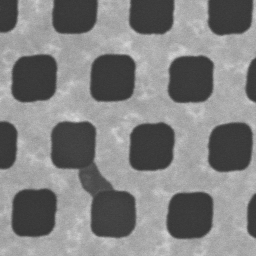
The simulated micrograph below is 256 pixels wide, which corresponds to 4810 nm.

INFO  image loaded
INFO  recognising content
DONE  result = holes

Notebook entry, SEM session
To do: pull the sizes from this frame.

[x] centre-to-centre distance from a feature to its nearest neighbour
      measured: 1.47 µm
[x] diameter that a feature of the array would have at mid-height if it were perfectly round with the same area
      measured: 946 nm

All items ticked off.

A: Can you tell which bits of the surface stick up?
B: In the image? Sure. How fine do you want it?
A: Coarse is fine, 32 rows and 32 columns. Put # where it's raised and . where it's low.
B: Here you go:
..#####.....####......####......
..#####.....####......####......
..####......####......####......
..#####.....####.....#####.....#
################################
################################
################################
##.....#####.....#####....######
##.....####......####......####.
#......####......####......####.
#......####......####......####.
#......####......####......####.
##....######....######....#####.
################################
################################
..#####.....######...#######...#
..####......####......####......
..####......####......####......
..####......####......####......
..####......####......####......
..#####.....####.....#####.....#
##########..###############..###
##########...###################
##########....##################
##.....####......#####....######
##.....####......####......####.
##.....####......####......####.
#......####......####......####.
#......####......####.....#####.
##....######....#####.....#####.
################################
################################